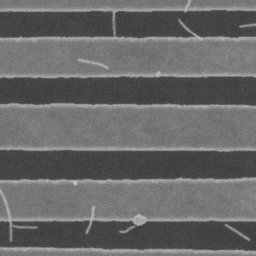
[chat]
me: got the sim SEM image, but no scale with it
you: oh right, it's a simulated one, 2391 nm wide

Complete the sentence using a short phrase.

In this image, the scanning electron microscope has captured lines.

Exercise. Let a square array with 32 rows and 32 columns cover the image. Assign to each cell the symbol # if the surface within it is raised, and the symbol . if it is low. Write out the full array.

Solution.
################################
................................
................................
................................
................................
################################
################################
################################
################################
#############......#............
................................
................................
................................
################################
################################
################################
################################
################################
################################
................................
................................
................................
...................#############
################################
################################
################################
################################
.#.........#....###...#.........
................................
................................
................................
################################